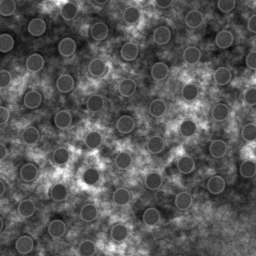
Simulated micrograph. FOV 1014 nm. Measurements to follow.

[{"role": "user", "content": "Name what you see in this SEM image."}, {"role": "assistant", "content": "a regular array of raised bodies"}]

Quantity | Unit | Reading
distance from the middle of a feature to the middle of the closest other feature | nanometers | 142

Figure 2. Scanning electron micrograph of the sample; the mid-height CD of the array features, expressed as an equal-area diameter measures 68.9 nm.